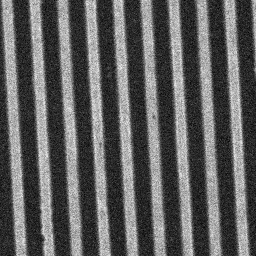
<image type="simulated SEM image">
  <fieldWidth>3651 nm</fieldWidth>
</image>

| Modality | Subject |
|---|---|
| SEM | parallel lines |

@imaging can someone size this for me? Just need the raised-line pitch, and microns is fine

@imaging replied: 0.396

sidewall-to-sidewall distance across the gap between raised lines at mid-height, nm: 244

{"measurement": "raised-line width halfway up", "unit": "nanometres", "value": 148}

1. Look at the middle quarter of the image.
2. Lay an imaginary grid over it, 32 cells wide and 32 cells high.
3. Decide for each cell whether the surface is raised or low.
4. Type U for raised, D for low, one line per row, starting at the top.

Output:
UUDDDDUUUDDDDUUUDDDDUUDDDDDUUUDD
UUDDDDUUUDDDDUUUDDDDUUUDDDDUUUDD
UUDDDDUUUDDDDUUUDDDDUUUDDDDUUUDD
UUDDDDDUUDDDDUUUDDDDUUUDDDDUUUDD
UUDDDDDUUDDDDUUUDDDDDUUDDDDUUUDD
UUDDDDDUUDDDDDUUDDDDDUUDDDDUUUDD
UUDDDDDUUDDDDDUUDDDDUUUDDDDDUUDD
UUDDDDDUUDDDDDUUDDDDUUUDDDDDUUDD
UUDDDDDUUDDDDDUUDDDDDUUDDDDDUUDD
UUDDDDDUUDDDDDUUDDDDDUUDDDDDUUDD
UUDDDDDUUDDDDDUUDDDDDUUDDDDDUUDD
UUDDDDDUUDDDDDUUDDDDDUUDDDDDUUDD
UUUDDDDUUDDDDDUUDDDDDUUDDDDDUUDD
UUUDDDDUUDDDDDUUDDDDDUUDDDDDUUDD
UUUDDDDUUUDDDDUUDDDDDUUDDDDDUUDD
UUUDDDDUUUDDDDUUDDDDDUUDDDDDUUDD
UUUDDDDUUUDDDDUUUDDDDUUUDDDDUUDD
UUUDDDDUUUDDDDUUUDDDDUUDDDDDUUUD
DUUDDDDUUUDDDDUUUDDDDUUDDDDDUUUD
DUUDDDDUUUDDDDUUUDDDDUUUDDDDUUUD
DUUDDDDUUUDDDDUUUDDDDUUUDDDDUUUD
DUUDDDDDUUDDDDUUUDDDDDUUDDDDUUUD
DUUDDDDDUUDDDDUUUDDDDDUUDDDDUUUD
DUUDDDDDUUDDDDDUUDDDDDUUDDDDUUUD
DUUDDDDDUUDDDDDUUDDDDDUUDDDDDUUD
DUUDDDDDUUDDDDDUUDDDDDUUDDDDDUUD
DUUDDDDDUUDDDDDUUDDDDDUUDDDDDUUD
DUUDDDDDUUDDDDDUUDDDDDUUDDDDDUUD
DUUDDDDDUUDDDDDUUDDDDDUUDDDDDUUD
DUUUDDDDUUDDDDDUUDDDDDUUDDDDDUUD
DUUDDDDDUUDDDDDUUDDDDDUUDDDDDUUD
DUUDDDDDUUUDDDDUUDDDDDUUDDDDDUUD